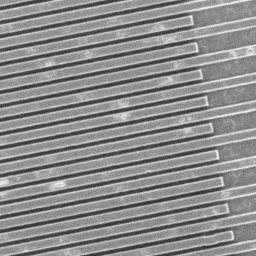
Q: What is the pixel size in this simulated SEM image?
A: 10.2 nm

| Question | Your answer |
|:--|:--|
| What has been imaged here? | parallel lines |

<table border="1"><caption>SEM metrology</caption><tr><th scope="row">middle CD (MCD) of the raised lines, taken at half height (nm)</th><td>95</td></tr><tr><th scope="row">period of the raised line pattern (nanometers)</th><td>139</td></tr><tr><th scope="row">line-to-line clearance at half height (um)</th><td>0.0438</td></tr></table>